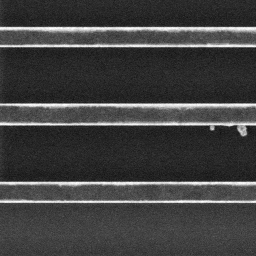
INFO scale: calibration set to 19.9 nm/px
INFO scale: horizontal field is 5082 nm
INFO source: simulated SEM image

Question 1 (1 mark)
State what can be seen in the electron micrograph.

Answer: lines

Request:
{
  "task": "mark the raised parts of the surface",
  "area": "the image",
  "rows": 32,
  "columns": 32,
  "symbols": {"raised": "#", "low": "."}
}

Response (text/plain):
................................
................................
................................
######.......#######..##..###...
################################
################################
................................
................................
................................
................................
................................
................................
................................
################################
################################
################################
................................
................................
................................
................................
................................
................................
................................
################################
################################
................................
................................
................................
................................
................................
................................
................................